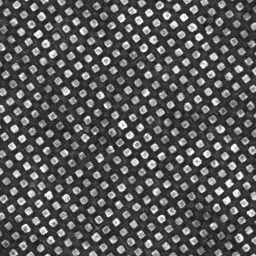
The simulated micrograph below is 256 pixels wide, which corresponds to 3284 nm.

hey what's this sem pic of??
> a regular array of raised bodies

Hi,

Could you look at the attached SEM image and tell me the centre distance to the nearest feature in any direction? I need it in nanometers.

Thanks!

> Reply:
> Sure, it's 156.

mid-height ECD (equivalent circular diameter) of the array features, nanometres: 92.7